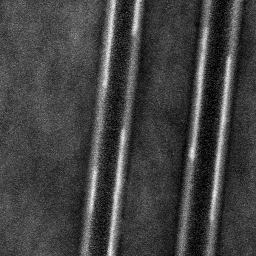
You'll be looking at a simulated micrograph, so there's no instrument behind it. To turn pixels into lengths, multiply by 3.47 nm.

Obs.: one or a few lines or trenches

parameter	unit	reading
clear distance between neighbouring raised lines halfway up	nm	220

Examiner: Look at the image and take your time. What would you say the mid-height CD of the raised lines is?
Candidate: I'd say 32.7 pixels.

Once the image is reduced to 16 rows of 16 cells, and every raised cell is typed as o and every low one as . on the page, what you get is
.......oo....oo.
.......oo....oo.
.......oo....oo.
......ooo...ooo.
......oo....oo..
......oo....oo..
......oo....oo..
......oo....oo..
......oo....oo..
......oo....oo..
......oo....oo..
......oo....oo..
......o.....oo..
.....oo....oo...
.....oo....oo...
.....oo....oo...